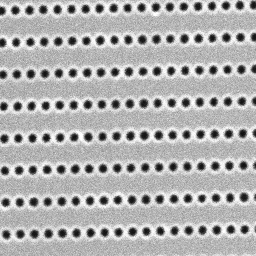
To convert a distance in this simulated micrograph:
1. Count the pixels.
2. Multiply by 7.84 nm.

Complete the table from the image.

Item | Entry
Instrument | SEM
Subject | a regular array of holes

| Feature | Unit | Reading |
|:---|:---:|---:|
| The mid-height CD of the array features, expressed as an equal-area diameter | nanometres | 74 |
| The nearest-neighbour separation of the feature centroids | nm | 108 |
